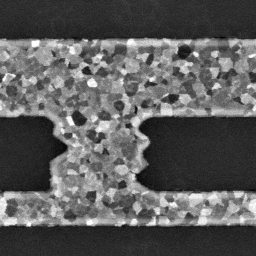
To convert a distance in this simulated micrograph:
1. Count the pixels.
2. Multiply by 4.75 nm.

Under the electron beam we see one or a few lines or trenches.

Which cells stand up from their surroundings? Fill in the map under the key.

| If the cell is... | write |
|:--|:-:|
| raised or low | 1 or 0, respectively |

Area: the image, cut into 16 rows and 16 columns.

0000000000000000
0000000000000000
0000000000000000
1111111111111111
1111111111111111
1111111111111111
1111111111111111
0001111110000000
0000111110000000
0000111110000000
0001111110000000
0001111110000000
1111111111111111
1111111111111111
0000000000000000
0000000000000000